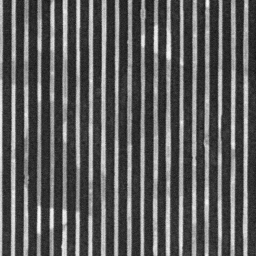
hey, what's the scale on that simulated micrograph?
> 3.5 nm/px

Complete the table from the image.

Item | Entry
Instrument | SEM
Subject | parallel lines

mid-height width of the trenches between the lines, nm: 33.7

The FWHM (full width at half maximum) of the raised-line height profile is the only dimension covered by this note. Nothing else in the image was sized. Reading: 0.0127 microns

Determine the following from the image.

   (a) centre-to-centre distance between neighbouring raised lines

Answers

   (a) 45.2 nm